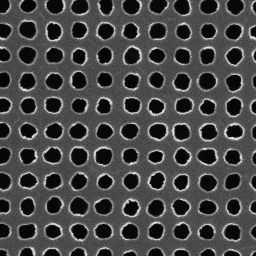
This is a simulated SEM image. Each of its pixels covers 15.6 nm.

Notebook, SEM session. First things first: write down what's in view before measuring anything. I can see a regular array of holes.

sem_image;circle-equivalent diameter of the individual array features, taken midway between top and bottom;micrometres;0.238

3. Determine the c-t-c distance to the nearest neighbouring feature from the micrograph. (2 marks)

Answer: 0.382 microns